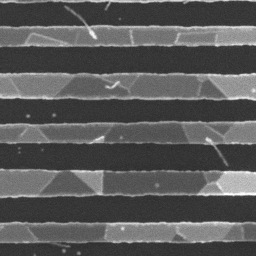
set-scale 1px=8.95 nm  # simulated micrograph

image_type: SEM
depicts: lines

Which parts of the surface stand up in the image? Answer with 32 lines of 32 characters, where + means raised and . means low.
................................
................................
................................
++++++++++++++++++++++++++++++++
++++++++++++++++++++++++++++++++
++++++++++++++++++++++++++++++++
................................
................................
................................
++++++++++++++++++++++++++++++++
++++++++++++++++++++++++++++++++
++++++++++++++++++++++++++++++++
................................
................................
................................
...........+++++++++++++++++++++
++++++++++++++++++++++++++++++++
++++++++++++++++++++++++++++++++
................................
................................
................................
++++++++++++++..++.++++++.++....
++++++++++++++++++++++++++++++++
++++++++++++++++++++++++++++++++
+++++++.........................
................................
................................
................................
++++++++++++++++++++++++++++++++
++++++++++++++++++++++++++++++++
................................
................................